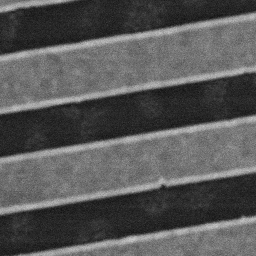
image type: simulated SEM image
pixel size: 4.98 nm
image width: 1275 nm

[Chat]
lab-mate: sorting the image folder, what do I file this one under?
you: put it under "one or a few lines or trenches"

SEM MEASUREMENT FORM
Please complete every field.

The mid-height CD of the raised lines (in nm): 260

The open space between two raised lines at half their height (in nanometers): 235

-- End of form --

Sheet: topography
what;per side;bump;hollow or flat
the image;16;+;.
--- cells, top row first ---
+...............
.............+++
.......+++++++++
.+++++++++++++++
+++++++++++++++.
+++++++++.......
+++.............
...............+
.........+++++++
...+++++++++++++
++++++++++++++++
++++++++++......
+++++...........
................
...........+++++
.....+++++++++++